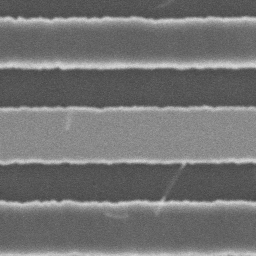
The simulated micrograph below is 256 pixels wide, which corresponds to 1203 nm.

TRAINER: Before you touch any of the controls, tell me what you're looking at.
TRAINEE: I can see lines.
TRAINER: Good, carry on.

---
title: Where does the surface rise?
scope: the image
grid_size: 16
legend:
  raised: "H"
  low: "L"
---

LLLLLLLLLLLLLLLL
HHHHHHHHHHHHHHHH
HHHHHHHHHHHHHHHH
HHHHHHHHHHHHHHHH
LLLLLLLLLLLLLLLL
LLLLLLLLLLLLLLLL
LLLLLLLLLLLLLLLL
HHHHHHHHHHHHHHHH
HHHHHHHHHHHHHHHH
HHHHHHHHHHHHHHHH
LLLLLLLLLLLLLLLL
LLLLLLLLLLLLLLLL
LLLLLLLLLLLLLLLL
HHHHHHHHHHHHHHHH
HHHHHHHHHHHHHHHH
HHHHHHHHHHHHHHHH